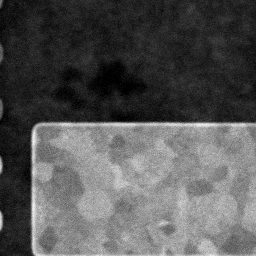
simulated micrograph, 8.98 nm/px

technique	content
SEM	wiring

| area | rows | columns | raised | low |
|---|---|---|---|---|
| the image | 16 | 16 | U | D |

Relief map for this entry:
DDDDDDDDDDDDDDDD
DDDDDDDDDDDDDDDD
DDDDDDDDDDDDDDDD
DDDDDDDDDDDDDDDD
DDDDDDDDDDDDDDDD
DDDDDDDDDDDDDDDD
DDDDDDDDDDDDDDDD
DDDDDDDDDDDDDDDD
DDUUUUUUUUUUUUUU
DDUUUUUUUUUUUUUU
DDUUUUUUUUUUUUUU
DDUUUUUUUUUUUUUU
DDUUUUUUUUUUUUUU
DDUUUUUUUUUUUUUU
DDUUUUUUUUUUUUUU
DDUUUUUUUUUUUUUU